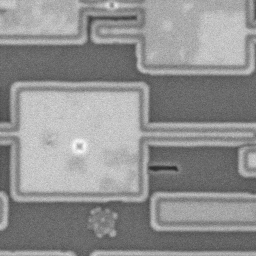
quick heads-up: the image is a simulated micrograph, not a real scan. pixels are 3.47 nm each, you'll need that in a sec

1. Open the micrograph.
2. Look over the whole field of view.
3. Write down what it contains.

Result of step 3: wiring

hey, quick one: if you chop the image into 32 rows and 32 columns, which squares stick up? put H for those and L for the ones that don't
HHHHHHHHHHHHHHHHHHHHHHHHHHHHHHHH
HHHHHHHHHHHHHHHHHHHHHHHHHHHHHHHH
HHHHHHHHHHHLLLLLLHHHHHHHHHHHHHHH
HHHHHHHHHHHLHHHHHHHHHHHHHHHHHHHH
HHHHHHHHHHHLHHHHHHHHHHHHHHHHHHHH
LLLLLLLLLLLLLLLLLHHHHHHHHHHHHHHH
LLLLLLLLLLLLLLLLLHHHHHHHHHHHHHHH
LLLLLLLLLLLLLLLLLHHHHHHHHHHHHHHH
LLLLLLLLLLLLLLLLLHHHHHHHHHHHHHHH
LLLLLLLLLLLLLLLLLLLLLLLLLLLLLLLL
LLHHHHHHHLHHHHLLHHLLLLLLLLLLLLLL
LHHHHHHHHHHHHHHHHHLLLLLLLLLLLLLL
LHHHHHHHHHHHHHHHHHLLLLLLLLLLLLLL
LHHHHHHHHHHHHHHHHHLLLLLLLLLLLLLL
LHHHHHHHHHHHHHHHHHLLLLLLLLLLLLLL
LHHHHHHHHHHHHHHHHHHLLLLLLLLLLLLL
HHHHHHHHHHHHHHHHHHHHHHHHHHHHHHHH
HHHHHHHHHHHHHHHHHHHHHHHHHHHHHHHH
LHHHHHHHHHHHHHHHHHLLLLLLLLLLLLHH
LHHHHHHHHHHHHHHHHHLLLLLLLLLLLLHH
LHHHHHHHHHHHHHHHHHLLLLLLLLLLLLHH
LHHHHHHHHHHHHHHHHHLLLLLLLLLLLLHH
LHHHHHHHHHHHHHHHHHLLLLLLLLLLLLLL
LHHHHHHHHHHHHHHHHHLLLLLLLLLLLLLL
HLHHHHHHHHHHHHHHHHLHHHHHHHHHHHHH
HLLLLLLLLLLLLLLLLLLHHHHHHHHHHHHH
HLLLLLLLLLLLLLLLLLLHHHHHHHHHHHHH
HLLLLLLLLLLLLLLLLLLHHHHHHHHHHHHH
LLLLLLLLLLLLLLLLLLLLHHHHHHHHHHHH
LLLLLLLLLLLLLLLLLLLLLLLLLLLLLLLL
LLLLLLLLLLLLLLLLLLLLLLLLLLLLLLLL
LLLLLLLLLLLLLLLLLLLLLLLLLLLLLLLL